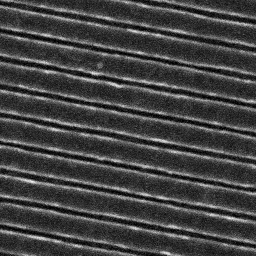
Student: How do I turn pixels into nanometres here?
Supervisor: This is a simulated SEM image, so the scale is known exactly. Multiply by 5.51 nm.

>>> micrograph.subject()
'parallel lines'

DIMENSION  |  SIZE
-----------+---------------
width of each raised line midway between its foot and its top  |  120 nm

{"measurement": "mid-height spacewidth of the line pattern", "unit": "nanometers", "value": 29.8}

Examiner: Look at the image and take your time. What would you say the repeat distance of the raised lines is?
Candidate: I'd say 27.5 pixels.